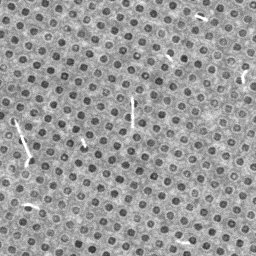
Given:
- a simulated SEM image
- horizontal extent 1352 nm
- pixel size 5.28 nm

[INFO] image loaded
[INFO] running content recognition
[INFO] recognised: a regular array of holes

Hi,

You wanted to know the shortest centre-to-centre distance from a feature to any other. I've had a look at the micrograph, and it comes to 77.8 nanometers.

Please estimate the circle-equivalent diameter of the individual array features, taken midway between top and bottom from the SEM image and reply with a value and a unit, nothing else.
0.0461 um